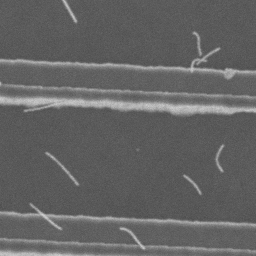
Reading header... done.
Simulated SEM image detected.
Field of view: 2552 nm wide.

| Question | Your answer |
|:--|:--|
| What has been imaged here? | lines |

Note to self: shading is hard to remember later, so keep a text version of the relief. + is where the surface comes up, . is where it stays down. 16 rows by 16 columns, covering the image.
................
................
................
................
++++++++++++++++
++++++++++++++++
.......+++++++++
................
................
................
................
................
................
+++.............
++++++++++++++++
++++++++++++++++